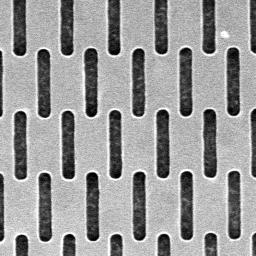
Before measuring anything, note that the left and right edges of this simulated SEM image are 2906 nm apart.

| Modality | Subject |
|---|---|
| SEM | a regular array of holes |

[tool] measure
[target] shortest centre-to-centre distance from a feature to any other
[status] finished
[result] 0.536 um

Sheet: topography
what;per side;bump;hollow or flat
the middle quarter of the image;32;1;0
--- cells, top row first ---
11111000011111111000111111110000
11111000011111111000111111110000
11111000011111111000111111110000
11111000011111111000111111110000
11111000011111111000111111111000
11111000111111111000111111111000
11111000111111111000111111111000
11111000011111111000111111111000
11111000111111111000111111111000
11111000111111111000111111111000
11111000111111111000111111111000
11111000111101111000111101111000
00111100111000111000111000111000
00011111111000011111111000111111
00011111111000011111111000111111
00011111111000011111111000111111
00011111111000011111111000111111
00011111111000011111111000111111
00011111111000011111111000111111
00011111111000011111111000111111
00011111111000011111111000111111
00011111111000011111111000111111
00011111111000011111111000011111
00011111111000011111111000011111
00011111111000011111111000011111
00011111111000011111111000011111
00011111111000011111111000011111
00011100111000111000111000111000
00111000011100111000011101111000
11111000011111111000011111111000
11111000011111111000011111111000
11111100011111111000011111111000